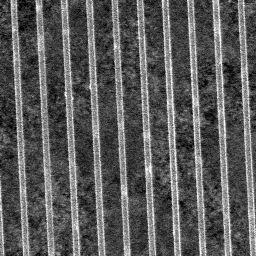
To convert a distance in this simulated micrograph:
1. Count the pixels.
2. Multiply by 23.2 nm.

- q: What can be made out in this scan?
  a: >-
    parallel lines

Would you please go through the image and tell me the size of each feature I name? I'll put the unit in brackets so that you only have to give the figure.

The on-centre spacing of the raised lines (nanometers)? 586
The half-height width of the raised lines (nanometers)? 131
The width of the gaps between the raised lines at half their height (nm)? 456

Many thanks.